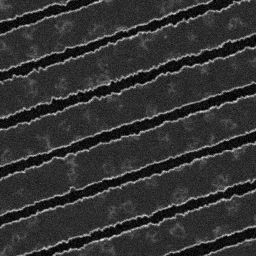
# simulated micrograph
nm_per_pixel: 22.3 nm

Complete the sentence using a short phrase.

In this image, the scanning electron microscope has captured parallel lines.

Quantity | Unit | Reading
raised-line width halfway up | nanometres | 244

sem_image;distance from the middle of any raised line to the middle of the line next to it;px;45.6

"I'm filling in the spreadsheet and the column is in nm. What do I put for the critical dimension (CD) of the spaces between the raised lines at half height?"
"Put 760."